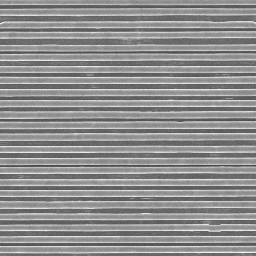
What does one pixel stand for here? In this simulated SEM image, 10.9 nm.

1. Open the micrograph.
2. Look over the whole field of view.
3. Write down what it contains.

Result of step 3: parallel lines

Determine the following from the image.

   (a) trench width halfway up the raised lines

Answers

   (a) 55.7 nanometres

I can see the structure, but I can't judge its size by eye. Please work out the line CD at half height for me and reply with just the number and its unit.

65.2 nanometres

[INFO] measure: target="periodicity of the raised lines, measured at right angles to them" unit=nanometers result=123